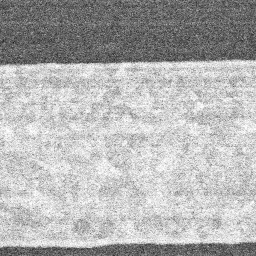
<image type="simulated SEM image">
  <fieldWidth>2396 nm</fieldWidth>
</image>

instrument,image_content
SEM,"one or a few lines or trenches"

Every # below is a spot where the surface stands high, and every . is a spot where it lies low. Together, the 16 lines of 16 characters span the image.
................
................
................
................
################
################
################
################
################
################
################
################
################
################
################
................